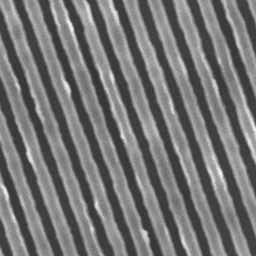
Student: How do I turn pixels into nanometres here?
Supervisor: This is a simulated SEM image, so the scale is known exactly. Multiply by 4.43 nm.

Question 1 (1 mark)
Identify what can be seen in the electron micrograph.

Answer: parallel lines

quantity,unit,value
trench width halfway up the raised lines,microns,0.046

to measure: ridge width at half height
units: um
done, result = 0.057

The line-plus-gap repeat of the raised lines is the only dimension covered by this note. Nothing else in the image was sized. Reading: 104 nm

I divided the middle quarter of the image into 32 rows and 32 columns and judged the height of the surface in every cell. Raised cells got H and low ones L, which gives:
LLHHHLLLHHHLLLHHHLLLLHHHLLLHHHLL
LLHHHHLLLHHHLLLHHHLLLHHHLLLHHHHL
LLLHHHLLLHHHLLLHHHLLLHHHHLLHHHHL
LLLHHHHLLHHHHLLHHHHLLHHHHLLLHHHL
HLLHHHHLLHHHHLLLHHHLLLHHHLLLHHHL
HLLLHHHLLLHHHLLLHHHHLLHHHHLLLHHH
HHLLHHHHLLHHHLLLLHHHLLLHHHLLLHHH
HHLLHHHHLLLHHHLLLHHHLLLHHHLLLHHH
HHLLLHHHLLLHHHLLLHHHLLLHHHHLLLHH
HHLLLHHHLLLHHHLLLHHHHLLLHHHLLLHH
HHLLLHHHHLLLHHHLLHHHHLLLHHHLLLHH
HHHLLLHHHLLLHHHLLLHHHLLLHHHLLLLH
HHHLLLHHHHLLHHHHLLHHHHLLLHHHLLLH
LHHLLLHHHHLLLHHHLLLHHHLLLHHHLLLL
LHHHLLLHHHLLLHHHLLLHHHHLLHHHHLLL
LHHHLLLHHHHLLLHHLLLLHHHLLLHHHLLL
LLHHHLLLHHHLLLHHHLLLHHHLLLHHHHLL
LLHHHLLLHHHLLLHHHLLLHHHHLLLHHHLL
LLHHHLLLHHHHLLHHHHLLLHHHLLLHHHHL
LLHHHHLLLHHHLLLHHHLLLHHHHLLHHHHL
LLLHHHLLLHHHHLLHHHLLLLHHHLLHHHHL
LLLHHHHLLHHHHLLLHHHLLLHHHLLLHHHL
HLLLHHHLLLHHHLLLHHHLLLHHHHLLHHHH
HLLLHHHLLLHHHLLLHHHHLLHHHHLLLHHH
HLLLHHHHLLHHHHLLLHHHLLLHHHLLLHHH
HHLLLHHHLLLHHHLLLHHHLLLHHHHLLHHH
HHLLLHHHLLLHHHHLLHHHLLLHHHHLLLHH
HHLLLHHHHLLLHHHLLLHHHLLLHHHLLLHH
HHHLLLHHHLLLHHHLLLHHHLLLHHHLLLLH
HHHLLLHHHLLLHHHHLLHHHLLLHHHHLLLH
HHHHLLLHHHLLHHHHLLLHHHLLLHHHLLLH
LHHHLLLHHHLLLHHHLLLHHHLLLHHHHLLL